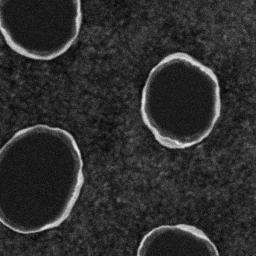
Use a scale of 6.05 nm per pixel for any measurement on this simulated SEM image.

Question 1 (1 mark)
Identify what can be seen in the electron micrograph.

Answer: raised bodies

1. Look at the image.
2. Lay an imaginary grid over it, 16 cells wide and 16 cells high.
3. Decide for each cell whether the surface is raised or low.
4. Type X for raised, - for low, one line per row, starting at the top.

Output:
XXXXX-----------
XXXXX-----------
-XXXX-----------
--XX------------
---------XXXX---
---------XXXXX--
---------XXXXX--
---------XXXX---
-XXX------XXX---
XXXXX-----------
XXXXX-----------
XXXXX-----------
XXXXX-----------
XXXX------------
-X-------XXX----
---------XXXX---